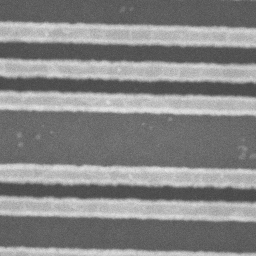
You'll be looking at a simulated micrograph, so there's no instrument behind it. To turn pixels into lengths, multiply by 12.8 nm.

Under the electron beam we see lines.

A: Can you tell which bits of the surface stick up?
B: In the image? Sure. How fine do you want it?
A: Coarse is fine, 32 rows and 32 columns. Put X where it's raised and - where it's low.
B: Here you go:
--------------------------------
--------------------------------
--------------------------------
XXXXXXXXXXXXXXXXXXXXXXXXXXXX----
XXXXXXXXXXXXXXXXXXXXXXXXXXXXXXXX
----------------X-X-XXXXXXXXXXXX
--------------------------------
XX------------------------------
XXXXXXXXXXXXXXXXXXXXXXXXXXXXXXXX
XXXX-XXXXXXXXXXXXXXXXXXXXXXXXXXX
--------------------------------
X-------------------------------
XXXXXXXXXXXXXXXXXXXXXXXXXXXXXXXX
-XXXXXXXXXXXXXXXXXXXXXXXXXXXXXXX
--------------------------------
--------------------------------
--------------------------------
--------------------------------
--------------------------------
--------------------------------
--------------------------------
XXXXXXXXXXXXXXXXXXXXXXXXXXXXXXXX
XXXXXXXXXXXXXXXXXXXXXXXXXXXXXXXX
--------------------------------
--------------------------------
XXXXXXXXXXXXXXXXXXXXXXXXXXXXXXXX
XXXXXXXXXXXXXXXXXXXXXXXXXXXXXXXX
--------------------------XXXXXX
--------------------------------
--------------------------------
--------------------------------
XXXXXXXXXXXXXXXXXX--------------